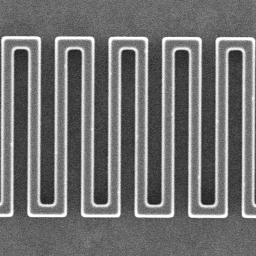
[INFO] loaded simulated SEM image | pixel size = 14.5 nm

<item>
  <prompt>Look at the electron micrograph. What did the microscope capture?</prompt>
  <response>groups of lines, slits or small figures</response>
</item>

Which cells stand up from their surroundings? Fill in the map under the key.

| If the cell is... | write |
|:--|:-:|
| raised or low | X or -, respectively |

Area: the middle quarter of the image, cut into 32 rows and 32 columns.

X----XX----XXX----XXX----XX----X
X----XX----XXX----XXX----XX----X
X----XX----XXX----XXX----XX----X
X----XX----XXX----XXX----XX----X
X----XX----XXX----XXX----XX----X
X----XX----XXX----XXX----XX----X
X----XX----XXX----XXX----XX----X
X----XX----XXX----XXX----XX----X
X----XX----XXX----XXX----XX----X
X----XX----XXX----XXX----XX----X
X----XX----XXX----XXX----XX----X
X----XX----XXX----XXX----XX----X
X----XX----XXX----XXX----XX----X
X----XX----XXX----XXX----XX----X
X----XX----XXX----XX-----XX----X
X----XX----XXX----XX-----XX----X
X----XX----XXX----XX-----XX----X
X----XX----XXX----XX-----XX----X
-----XX----XXX----XX-----XX----X
-----XX----XXX----XX-----XX----X
-----XX----XXX----XX-----XX----X
-----XX----XXX----XX-----XX----X
-----XX----XXX----XX-----XX----X
-----XX----XXX----XX-----XX----X
-----XX----XXX----XX-----XX----X
-----XX----XXX----XX-----XX----X
-----XX----XXX----XX-----XX----X
-----XX----XXX----XX-----XX----X
-----XX----XXX----XX-----XX----X
-----XX----XXX----XX-----XX----X
-----XX----XXX----XX-----XX----X
-----XX----XXX----XX-----XX----X